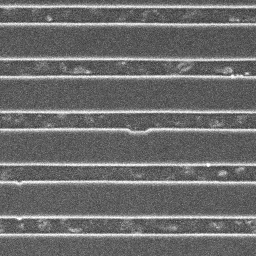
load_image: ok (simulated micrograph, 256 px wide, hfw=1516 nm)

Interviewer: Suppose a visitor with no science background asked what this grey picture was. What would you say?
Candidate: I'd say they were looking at parallel lines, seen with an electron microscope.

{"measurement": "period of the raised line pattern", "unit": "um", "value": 0.312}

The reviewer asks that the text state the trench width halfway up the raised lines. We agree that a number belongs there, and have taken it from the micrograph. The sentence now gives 0.0947 um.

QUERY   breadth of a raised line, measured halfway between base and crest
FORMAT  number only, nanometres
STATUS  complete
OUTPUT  215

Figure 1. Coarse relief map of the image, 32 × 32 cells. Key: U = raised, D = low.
UUUUUUUUUUUUUUUUUUUUUUUUUUUUUUUU
DDDDDDDDDDDDDDDDDDDDDDDDDDDDDDDD
DDDDDDDDDDDDDDDDDDDDDDDDDDDDDDDD
UUUUUUUUUUUUUUUUUUUUUUUUUUUUUUUU
UUUUUUUUUUUUUUUUUUUUUUUUUUUUUUUU
UUUUUUUUUUUUUUUUUUUUUUUUUUUUUUUU
UUUUUUUUUUUUUUUUUUUUUUUUUUUUUUUU
DDDDDDDDDDDDDDDDDDDDUUUUUUUUUDDD
DDDDDDDDDDDDDDDDDDDDDDDDDDDDDDDD
DDDDDDDDDDDDDDDDDDDDDDDDDDDDDDDD
UUUUUUUUUUUUUUUUUUUUUUUUUUUUUUUU
UUUUUUUUUUUUUUUUUUUUUUUUUUUUUUUU
UUUUUUUUUUUUUUUUUUUUUUUUUUUUUUUU
UUUUUUUUUUUUUUUUUUUUUUUUUUUUUUUU
DDDDDDDDDDDDDDDDDDDDDDDDDDDDDDDD
DDDDDDDDDDDDDDDDDDDDDDDDDDDDDDDD
UUUUUUUUUUUUUUUUUDUUUUUUUUUUUUUU
UUUUUUUUUUUUUUUUUUUUUUUUUUUUUUUU
UUUUUUUUUUUUUUUUUUUUUUUUUUUUUUUU
UUUUUUUUUUUUUUUUUUUUUUUUUUUUUUUU
UUUUUUUUUUUUUUUUUUUUUUUUUUUUUUUU
DDDDDDDDDDDDDDDDDDDDDDDDDDDDDDDD
DDDDDDDDDDDDDDDDDDDDDDDDDDDDDDDD
UUUUUUUUUUUUUUUUUUUUUUUUUUUUUUUU
UUUUUUUUUUUUUUUUUUUUUUUUUUUUUUUU
UUUUUUUUUUUUUUUUUUUUUUUUUUUUUUUU
UUUUUUUUUUUUUUUUUUUUUUUUUUUUUUUU
DDDDDDDDDDDDDDDDDDDDDDDDDDDDDDDD
DDDDDDDDDDDDDDDDDDDDDDDDDDDDDDDD
UUUUUUUUUUUUUUUUUUUUUUUUUUUUUUUU
UUUUUUUUUUUUUUUUUUUUUUUUUUUUUUUU
UUUUUUUUUUUUUUUUUUUUUUUUUUUUUUUU